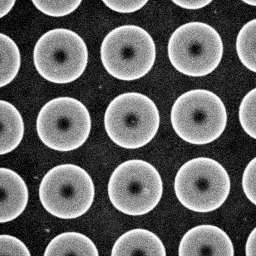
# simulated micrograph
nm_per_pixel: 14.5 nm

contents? an array of small figures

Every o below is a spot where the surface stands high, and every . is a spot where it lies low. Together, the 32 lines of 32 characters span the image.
oo..oooooo...ooooo....oooo.....o
o....oooo.......................
................................
...............ooo....ooooo...oo
o....ooooo...oooooo...ooooo...oo
oo...ooooo...oooooo..ooooooo..oo
oo..ooooooo..oooooo..ooooooo..oo
oo..ooooooo..oooooo..ooooooo..oo
oo...oooooo..oooooo...ooooo....o
oo...ooooo....oooo..............
o...............................
........................oo.....o
.......oo.....ooooo...ooooo...oo
oo...oooooo...oooooo..oooooo..oo
ooo..oooooo..ooooooo.ooooooo..oo
ooo..oooooo..ooooooo..oooooo..oo
ooo..oooooo..oooooo...oooooo...o
ooo..oooooo...ooooo....oooo.....
oo.....ooo......o...............
................................
...............oooo....oooo....o
oo....ooooo...oooooo..oooooo...o
ooo..oooooo...oooooo..ooooooo.oo
ooo..ooooooo..oooooo..ooooooo.oo
ooo..ooooooo..oooooo..oooooo...o
ooo..oooooo...oooooo...ooooo....
ooo...ooooo....ooo..............
o...............................
........................ooo.....
o......ooo.....oooo....ooooo...o
ooo...oooooo..oooooo...oooooo..o
oooo..oooooo..ooooooo.ooooooo..o